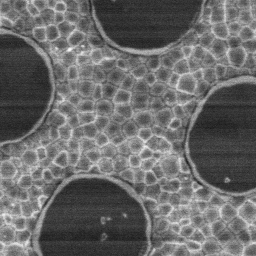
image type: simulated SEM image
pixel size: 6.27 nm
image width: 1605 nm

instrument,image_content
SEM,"raised bodies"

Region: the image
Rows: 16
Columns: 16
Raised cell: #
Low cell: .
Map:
......#######...
......######....
##.....####.....
###.............
###.............
###..........###
###..........###
###.........####
##..........####
............####
............####
....####.....###
...######.......
...######.......
..#######.......
..#######.......